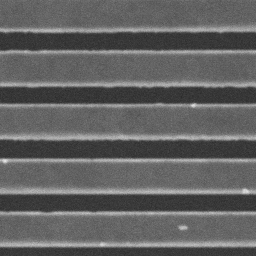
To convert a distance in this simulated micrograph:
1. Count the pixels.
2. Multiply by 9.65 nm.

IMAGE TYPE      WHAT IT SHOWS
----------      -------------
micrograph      lines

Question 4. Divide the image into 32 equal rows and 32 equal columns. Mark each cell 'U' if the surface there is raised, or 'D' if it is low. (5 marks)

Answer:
UUUUUUUUUUUUUUUUUUUUUUUUUUUUUUUU
UUUUUUUUUUUUUUUUUUUUUUUUUUUUUUUU
UUUUUUUUUUUUUUUUUUUUUUUUUUUUUUUU
UUUUUUUUUUUUUUUUUUUUUUUUUUUUUUUU
DDDDDDDDDDDDDDDDDDDDDDDDDDDDDDDD
DDDDDDDDDDDDDDDDDDDDDDDDDDDDDDDD
UUUUUUUUUUUUUUUUUUUUUUUUUUUUUUUU
UUUUUUUUUUUUUUUUUUUUUUUUUUUUUUUU
UUUUUUUUUUUUUUUUUUUUUUUUUUUUUUUU
UUUUUUUUUUUUUUUUUUUUUUUUUUUUUUUU
UUUUUUUUUUUUUUUUUUUUUUUUUUUUUUUU
DDDDDDDDDDDDDDDDDDDDDDDDDDDDDDDD
DDDDDDDDDDDDDDDDDDDDDDDDDDDDDDDD
UUUUUUUUUUUUUUUUUUUUUUUUUUUUUUUU
UUUUUUUUUUUUUUUUUUUUUUUUUUUUUUUU
UUUUUUUUUUUUUUUUUUUUUUUUUUUUUUUU
UUUUUUUUUUUUUUUUUUUUUUUUUUUUUUUU
DDDDDDDDDDDDDDDDDDDDDDDDDDDDDDDD
DDDDDDDDDDDDDDDDDDDDDDDDDDDDDDDD
DDDDDDDDDDDDDDDDDDDDDDDDDDDDDDDD
UUUUUUUUUUUUUUUUUUUUUUUUUUUUUUUU
UUUUUUUUUUUUUUUUUUUUUUUUUUUUUUUU
UUUUUUUUUUUUUUUUUUUUUUUUUUUUUUUU
UUUUUUUUUUUUUUUUUUUUUUUUUUUUUUUU
DDDDDDDDDDDDDDDDDDDDDDDDDDDDDDDD
DDDDDDDDDDDDDDDDDDDDDDDDDDDDDDDD
DDDDDDDDDDDDDDDDDDDDDDDDDDDDDDDD
UUUUUUUUUUUUUUUUUUUUUUUUUUUUUUUU
UUUUUUUUUUUUUUUUUUUUUUUUUUUUUUUU
UUUUUUUUUUUUUUUUUUUUUUUUUUUUUUUU
UUUUUUUUUUUUUUUUUUUUUUUUUUUUUUUU
DDDDDDDDDDDDDDDDDDDDDDDDDDDDDDDD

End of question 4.